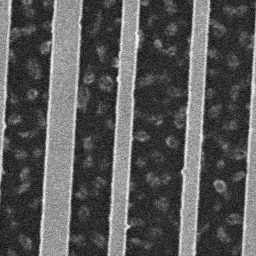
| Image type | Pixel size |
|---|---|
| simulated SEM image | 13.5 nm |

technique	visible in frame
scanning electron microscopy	one or a few lines or trenches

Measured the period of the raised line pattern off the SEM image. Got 895 nanometres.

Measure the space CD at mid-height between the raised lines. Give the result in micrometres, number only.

0.648